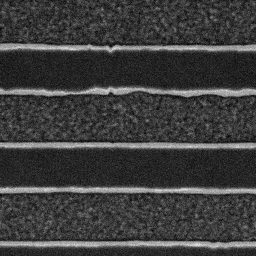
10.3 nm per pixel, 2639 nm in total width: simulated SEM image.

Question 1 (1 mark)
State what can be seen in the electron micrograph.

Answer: one or a few lines or trenches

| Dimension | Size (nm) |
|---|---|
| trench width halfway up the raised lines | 534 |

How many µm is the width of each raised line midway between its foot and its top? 0.478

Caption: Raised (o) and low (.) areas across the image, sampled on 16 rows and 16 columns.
................
................
................
oooooooooooooooo
oooooooooooooooo
oooooooooooooooo
................
................
................
oooooooooooooooo
oooooooooooooooo
oooooooooooooooo
................
................
................
oooooooooooooooo